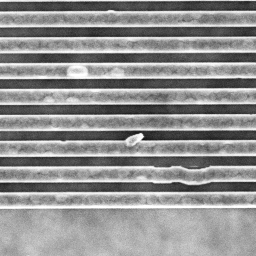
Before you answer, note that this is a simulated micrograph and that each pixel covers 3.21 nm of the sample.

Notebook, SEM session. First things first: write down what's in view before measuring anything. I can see parallel lines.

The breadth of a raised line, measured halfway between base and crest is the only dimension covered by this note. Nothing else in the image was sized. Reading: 50.6 nm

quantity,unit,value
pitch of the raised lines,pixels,25.9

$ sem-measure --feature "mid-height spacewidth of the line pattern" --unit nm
34.6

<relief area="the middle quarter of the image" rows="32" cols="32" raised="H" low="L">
HHHHHHHHHHHHHHHHHHHHHHHHHHHHHHHH
HHHHHHHHHHHHHHHHHHHHHHHHHHHHHHHH
HHHHHHHHHHHHHHHHHHHHHHHHHHHHHHHH
LLLLLLLLLLLLLLLLLLLLLLLLLLLLLLLL
LLLLLLLLLLLLLLLLLLLLLLLLLLLLLLLL
LLLLLLLLLLLLLLLLLLLLLLLLLLLLLLLL
HHHHHHHHHHHHHHHHHHHHHHHHHHHHHHHH
HHHHHHHHHHHHHHHHHHHHHHHHHHHHHHHH
HHHHHHHHHHHHHHHHHHHHHHHHHHHHHHHH
HHHHHHHHHHHHHHHHHHHHHHHHHHHHHHHH
LLLLLLLLLLLLLLLLLLLLLLLLLLLLLLLL
LLLLLLLLLLLLLLLLLLLLLLLLLLLLLLLL
LLLLLLLLLLLLLLLLLLLLLLLLLLLLLLLL
HHHHHHHHHHHHHHHHHHHHHHHHHHHHHHHH
HHHHHHHHHHHHHHHHHHHHHHHHHHHHHHHH
HHHHHHHHHHHHHHHHHHHHHHHHHHHHHHHH
LLLLLLLLLLLLLLLLLLLLLLLLLLLLLLLL
LLLLLLLLLLLLLLLLLLLLLLLLLLLLLLLL
LLLLLLLLLLLLLLLLHHHHLLLLLLLLLLLL
HHHHHHHHHHHHHHHHHHHHHHHHHHHHHHHH
HHHHHHHHHHHHHHHHHHHHHHHHHHHHHHHH
HHHHHHHHHHHHHHHHHHHHHHHHHHHHHHHH
HHHHHHHHHHHHHHHHHHHHHHHHHHHHHHHH
LLLLLLLLLLLLLLLLLLLLLLLLLLLLLLLL
LLLLLLLLLLLLLLLLLLLLLLLLLLLLLLLL
LLLLLLLLLLLLLLLLLLLLLLLLLLLLLLLL
HHHHHHHHHHHHHHHHHHHHHHHHHHHHHHHL
HHHHHHHHHHHHHHHHHHHHHHHHHHHHHHHH
HHHHHHHHHHHHHHHHHHHHHHHHHHHHHHHH
LLLLLLLLLLLLLHHHLLLLLLLLLLLLLLHH
LLLLLLLLLLLLLLLLLLLLLLLLLLLLLLLL
LLLLLLLLLLLLLLLLLLLLLLLLLLLLLLLL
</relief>